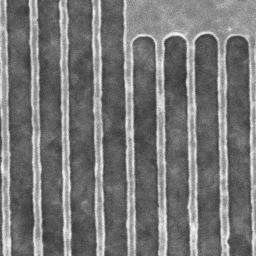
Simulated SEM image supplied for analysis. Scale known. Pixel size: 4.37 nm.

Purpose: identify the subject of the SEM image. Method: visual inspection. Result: parallel lines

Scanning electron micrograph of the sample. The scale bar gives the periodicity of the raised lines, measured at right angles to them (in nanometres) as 136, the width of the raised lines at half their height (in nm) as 29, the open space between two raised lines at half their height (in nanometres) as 107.